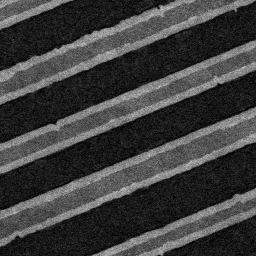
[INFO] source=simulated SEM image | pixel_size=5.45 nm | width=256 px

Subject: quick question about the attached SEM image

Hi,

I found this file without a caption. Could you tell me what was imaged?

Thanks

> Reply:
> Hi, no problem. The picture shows one or a few lines or trenches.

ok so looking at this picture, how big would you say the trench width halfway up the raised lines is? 237 nanometres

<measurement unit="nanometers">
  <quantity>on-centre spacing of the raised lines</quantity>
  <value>362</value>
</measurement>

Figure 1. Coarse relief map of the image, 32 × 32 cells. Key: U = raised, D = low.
UUUUUUUDDDDDDDDDDDDDDDUUUUUUUUDD
UUUUDDDDDDDDDDDDDDDDUUUUUUUDDDDD
UUDDDDDDDDDDDDDDDUUUUUUUUDDDDDDD
DDDDDDDDDDDDDDDUUUUUUUDDDDDDDDDD
DDDDDDDDDDDDUUUUUUUUDDDDDDDDDDDD
DDDDDDDDDDUUUUUUUDDDDDDDDDDDDDDD
DDDDDDDUUUUUUUUDDDDDDDDDDDDDDUUU
DDDDUUUUUUUUDDDDDDDDDDDDDDDUUUUU
DDUUUUUUUUDDDDDDDDDDDDDDUUUUUUUD
UUUUUUUUDDDDDDDDDDDDDDUUUUUUUDDD
UUUUUDDDDDDDDDDDDDDDUUUUUUDDDDDD
UUUDDDDDDDDDDDDDDUUUUUUUDDDDDDDD
DDDDDDDDDDDDDDDUUUUUUUDDDDDDDDDD
DDDDDDDDDDDDUUUUUUUDDDDDDDDDDDDD
DDDDDDDDDDUUUUUUUDDDDDDDDDDDDDUU
DDDDDDDDUUUUUUDDDDDDDDDDDDDDUUUU
DDDDDUUUUUUUDDDDDDDDDDDDDUUUUUUU
DDUUUUUUUDDDDDDDDDDDDDDUUUUUUUUD
UUUUUUUDDDDDDDDDDDDDDUUUUUUUUDDD
UUUUDDDDDDDDDDDDDDUUUUUUUUUDDDDD
UUDDDDDDDDDDDDDDUUUUUUUUDDDDDDDD
DDDDDDDDDDDDDUUUUUUUUUDDDDDDDDDD
DDDDDDDDDDDUUUUUUUUDDDDDDDDDDDDD
DDDDDDDDUUUUUUUUUDDDDDDDDDDDDDDD
DDDDDDUUUUUUUUDDDDDDDDDDDDDDDDDU
DDDUUUUUUUUUDDDDDDDDDDDDDDDDUUUU
DUUUUUUUUDDDDDDDDDDDDDDDDDUUUUUU
UUUUUUUDDDDDDDDDDDDDDDDDUUUUUDDD
UUUUUDDDDDDDDDDDDDDDDUUUUUUDDDDD
UUDDDDDDDDDDDDDDDDDUUUUUDDDDDDDD
DDDDDDDDDDDDDDDDUUUUUUDDDDDDDDDD
DDDDDDDDDDDDDDUUUUUUDDDDDDDDDDDD